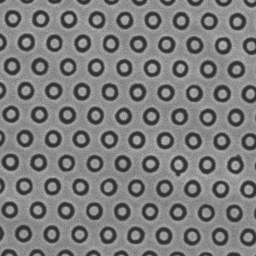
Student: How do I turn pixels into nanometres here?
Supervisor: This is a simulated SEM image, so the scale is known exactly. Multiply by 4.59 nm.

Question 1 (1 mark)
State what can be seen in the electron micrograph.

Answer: a regular array of ring-shaped grooves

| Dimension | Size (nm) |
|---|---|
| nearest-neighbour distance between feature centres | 125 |